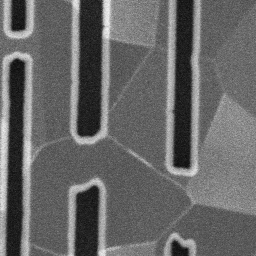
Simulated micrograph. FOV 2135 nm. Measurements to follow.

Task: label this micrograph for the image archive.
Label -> one or a few lines or trenches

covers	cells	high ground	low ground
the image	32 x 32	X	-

X---XXXXX----XXXXXXXXX---XXXXXXX
X---XXXXX----XXXXXXXXX---XXXXXXX
X---XXXXX----XXXXXXXXX---XXXXXXX
X---XXXXXX---XXXXXXXXX---XXXXXXX
XXXXXXXXXX---XXXXXXXX----XXXXXXX
XXXXXXXXXX---XXXXXXXX----XXXXXXX
XXXXXXXXX----XXXXXXXX---XXXXXXXX
X--XXXXXX----XXXXXXXX---XXXXXXXX
X---XXXXX----XXXXXXXX---XXXXXXXX
X---XXXXX----XXXXXXXX---XXXXXXXX
X---XXXXXX---XXXXXXXX---XXXXXXXX
X---XXXXX----XXXXXXXX---XXXXXXXX
X--XXXXXX----XXXXXXXX---XXXXXXXX
X--XXXXXX----XXXXXXXX---XXXXXXXX
X--XXXXXX----XXXXXXXX---XXXXXXXX
X--XXXXXX----XXXXXXXX---XXXXXXXX
X--XXXXXX----XXXXXXXX---XXXXXXXX
X--XXXXXXXXXXXXXXXXXX---XXXXXXXX
X--XXXXXXXXXXXXXXXXXX---XXXXXXXX
X--XXXXXXXXXXXXXXXXXX---XXXXXXXX
X--XXXXXXXXXXXXXXXXXX---XXXXXXXX
X--XXXXXXXXXXXXXXXXXXXXXXXXXXXXX
X--XXXXXXXXXXXXXXXXXXXXXXXXXXXXX
X--XXXXXXXX--XXXXXXXXXXXXXXXXXXX
X--XXXXXX----XXXXXXXXXXXXXXXXXXX
---XXXXXX----XXXXXXXXXXXXXXXXXXX
---XXXXXX----XXXXXXXXXXXXXXXXXXX
---XXXXXX----XXXXXXXXXXXXXXXXXXX
---XXXXXX----XXXXXXXXXXXXXXXXXXX
---XXXXXX----XXXXXXXXXXXXXXXXXXX
---XXXXXX----XXXXXXXX--XXXXXXXXX
---XXXXXX----XXXXXXXX---XXXXXXXX